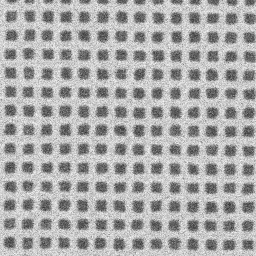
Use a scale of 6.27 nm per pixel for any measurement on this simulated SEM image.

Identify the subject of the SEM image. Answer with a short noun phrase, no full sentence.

a regular array of holes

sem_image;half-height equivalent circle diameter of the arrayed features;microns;0.0864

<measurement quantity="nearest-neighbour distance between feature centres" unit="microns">0.113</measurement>